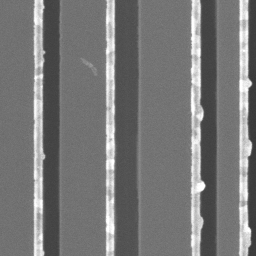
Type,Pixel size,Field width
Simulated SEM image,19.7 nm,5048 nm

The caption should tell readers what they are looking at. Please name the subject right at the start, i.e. lines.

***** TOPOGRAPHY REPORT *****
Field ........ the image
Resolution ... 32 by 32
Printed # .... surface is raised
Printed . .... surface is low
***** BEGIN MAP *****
#####...######...########..####.
#####...######...########..####.
#####...######...########..####.
#####...######...########..####.
#####...######...########..####.
#####...######...########..####.
#####...######...########..####.
#####...######...########..####.
#####...######...########..####.
#####...######...########..####.
#####...######...########..####.
#####...######...########..####.
#####...######...########..####.
#####...######...########..####.
#####...######...########..####.
#####...######...########..####.
#####...######...########..####.
#####...######...########..####.
#####...######...########..####.
######..######...########..####.
#####...######...########..####.
#####...######...########..####.
#####...######...########..####.
#####...######...########..####.
#####...######...########..####.
#####...######...########..####.
#####...######...########..####.
#####...######...########..####.
#####...######...########..####.
#####...######...########..####.
#####...######...########..####.
#####...######...########..####.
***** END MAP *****